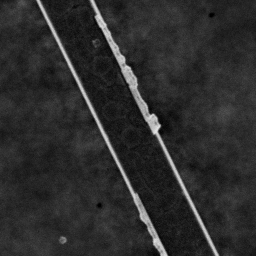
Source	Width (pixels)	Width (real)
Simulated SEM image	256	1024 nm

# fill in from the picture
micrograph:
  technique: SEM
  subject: one or a few lines or trenches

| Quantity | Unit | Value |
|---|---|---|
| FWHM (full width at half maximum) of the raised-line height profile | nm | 203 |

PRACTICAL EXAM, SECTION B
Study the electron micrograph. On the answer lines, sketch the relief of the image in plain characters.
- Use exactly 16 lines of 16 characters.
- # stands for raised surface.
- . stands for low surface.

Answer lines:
...###..........
...####.........
....###.........
....####........
.....###........
.....####.......
......###.......
......####......
.......###......
.......###......
.......####.....
........###.....
........####....
.........###....
.........####...
..........###...